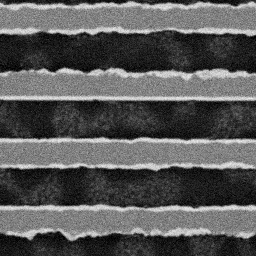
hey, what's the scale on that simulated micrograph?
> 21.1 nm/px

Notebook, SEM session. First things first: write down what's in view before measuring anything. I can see one or a few lines or trenches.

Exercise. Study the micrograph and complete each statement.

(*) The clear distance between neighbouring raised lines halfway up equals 890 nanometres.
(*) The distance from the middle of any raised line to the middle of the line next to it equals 1420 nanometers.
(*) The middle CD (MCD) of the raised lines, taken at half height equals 529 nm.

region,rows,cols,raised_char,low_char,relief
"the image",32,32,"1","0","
00000000000000000000000001000000
11111111111111111111111111111111
11111111111111111111111111111111
11111111111111111111111111111111
00000000000000000000000000000000
00000000000000000000000000000000
00000000000000000000000000000000
00000000000000000000000000000000
00000000000000000000000000000000
11111111111111111111111111111111
11111111111111111111111111111111
11111111111111111111111111111111
00000000000000000000000000000000
00000000000000000000000000000000
00000000000000000000000000000000
00000000000000000000000000000000
00000000000000000000000000000000
00000000101110000000000000000000
11111111111111111111111111111111
11111111111111111111111111111111
11111111111111111111111111111111
00000000000000000000000000000000
00000000000000000000000000000000
00000000000000000000000000000000
00000000000000000000000000000000
00000000000000000000000000000000
11111111111111111111111111111111
11111111111111111111111111111111
11111111111111111111111111111111
00000000000000000000000000000010
00000000000000000000000000000000
00000000000000000000000000000000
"